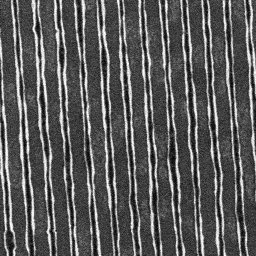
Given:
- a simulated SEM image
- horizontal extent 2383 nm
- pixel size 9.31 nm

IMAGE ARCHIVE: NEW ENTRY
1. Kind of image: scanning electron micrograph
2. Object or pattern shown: parallel lines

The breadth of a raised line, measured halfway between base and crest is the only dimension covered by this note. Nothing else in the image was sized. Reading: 61.5 nm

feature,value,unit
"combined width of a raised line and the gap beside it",196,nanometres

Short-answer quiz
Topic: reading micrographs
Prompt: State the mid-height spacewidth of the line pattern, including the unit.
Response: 0.138 µm